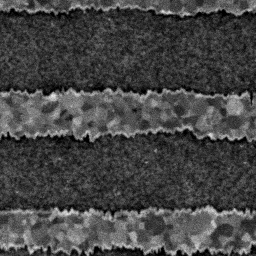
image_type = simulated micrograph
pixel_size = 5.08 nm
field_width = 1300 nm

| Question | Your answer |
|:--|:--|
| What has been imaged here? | one or a few lines or trenches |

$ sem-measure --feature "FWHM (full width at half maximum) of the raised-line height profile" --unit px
40.2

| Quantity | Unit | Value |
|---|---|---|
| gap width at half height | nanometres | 408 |